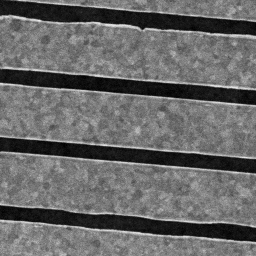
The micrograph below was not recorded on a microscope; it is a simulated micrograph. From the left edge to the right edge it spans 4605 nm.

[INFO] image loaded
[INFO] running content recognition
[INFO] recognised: one or a few lines or trenches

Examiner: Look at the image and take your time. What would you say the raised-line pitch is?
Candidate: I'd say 1220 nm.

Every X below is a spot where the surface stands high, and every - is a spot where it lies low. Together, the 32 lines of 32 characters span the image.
--------XXXXXXXXXXXXXXXXXXXXXXXX
-------------------XXXXXXXXXXXXX
XXXX---------------------------X
XXXXXXXXXXXXXXXXX---------------
XXXXXXXXXXXXXXXXXXXXXXXXXXXXXXX-
XXXXXXXXXXXXXXXXXXXXXXXXXXXXXXXX
XXXXXXXXXXXXXXXXXXXXXXXXXXXXXXXX
XXXXXXXXXXXXXXXXXXXXXXXXXXXXXXXX
XXXXXXXXXXXXXXXXXXXXXXXXXXXXXXXX
------------XXXXXXXXXXXXXXXXXXXX
X----------------------X-XXXXXXX
XXXXXXXXXXXX--------------------
XXXXXXXXXXXXXXXXXXXXXXX---------
XXXXXXXXXXXXXXXXXXXXXXXXXXXXXXXX
XXXXXXXXXXXXXXXXXXXXXXXXXXXXXXXX
XXXXXXXXXXXXXXXXXXXXXXXXXXXXXXXX
XXXXXXXXXXXXXXXXXXXXXXXXXXXXXXXX
------XXXXXXXXXXXXXXXXXXXXXXXXXX
-----------------XXXXXXXXXXXXXXX
XXXXXX-----------------------XXX
XXXXXXXXXXXXXXXXX---------------
XXXXXXXXXXXXXXXXXXXXXXXXXXXXX---
XXXXXXXXXXXXXXXXXXXXXXXXXXXXXXXX
XXXXXXXXXXXXXXXXXXXXXXXXXXXXXXXX
XXXXXXXXXXXXXXXXXXXXXXXXXXXXXXXX
XXXXXXXXXXXXXXXXXXXXXXXXXXXXXXXX
---------XXXXXXXXXXXXXXXXXXXXXXX
---------------------XXXXXXXXXXX
XXXXXXXXXXX---------------------
XXXXXXXXXXXXXXXXXXXXX-----------
XXXXXXXXXXXXXXXXXXXXXXXXXXXXXXXX
XXXXXXXXXXXXXXXXXXXXXXXXXXXXXXXX